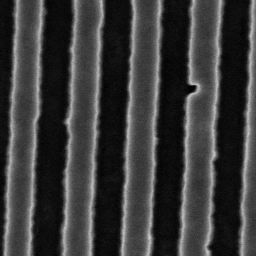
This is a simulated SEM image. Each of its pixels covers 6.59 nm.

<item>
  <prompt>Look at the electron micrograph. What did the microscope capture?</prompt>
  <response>parallel lines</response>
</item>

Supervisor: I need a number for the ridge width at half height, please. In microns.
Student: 0.197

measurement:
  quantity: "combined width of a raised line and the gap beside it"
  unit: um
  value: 0.389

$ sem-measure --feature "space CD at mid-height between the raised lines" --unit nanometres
191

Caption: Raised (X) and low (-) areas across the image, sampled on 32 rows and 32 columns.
--XXX----XXXX---XXXX----XXXX---X
--XXX----XXXX----XXX----XXXX---X
--XXX----XXXX---XXXX----XXXX---X
--XXX----XXXX---XXXX----XXXX---X
--XXX----XXXX---XXXX----XXX----X
--XXX----XXXX---XXXX----XXX----X
--XXX----XXXX---XXXX----XXX----X
--XXX----XXX----XXXX----XXX----X
--XXX----XXXX---XXXX----XXX----X
--XXX----XXX----XXXX----XXX----X
--XXX----XXX----XXXX----XXX----X
-XXXX----XXX----XXXX----XXX----X
-XXXX----XXX----XXXX---XXXX----X
-XXXX----XXX----XXXX---XXXX----X
-XXXX----XXX----XXXX---XXXX----X
-XXXX---XXXX----XXX----XXXX----X
-XXXX---XXXX----XXXX---XXXX----X
-XXXX----XXX----XXXX---XXXX----X
-XXX----XXXX----XXX----XXXX----X
-XXX----XXXX----XXX----XXXX----X
-XXX----XXXX----XXX----XXXX---XX
-XXX----XXXX----XXX----XXXX---XX
-XXX----XXXX----XXX----XXXX---XX
-XXX----XXXX---XXXX----XXXX---XX
-XXX----XXXX---XXXX----XXXX---XX
-XXX----XXXX---XXXX----XXXX---XX
-XXX----XXXX---XXXX----XXXX---XX
-XXX----XXXX---XXXX----XXX----XX
-XXX----XXXX---XXXX----XXXX---XX
-XXX----XXXX---XXXX----XXX----XX
-XXX----XXXX---XXXX---XXXX----XX
XXXX----XXXX---XXXX---XXXX----XX